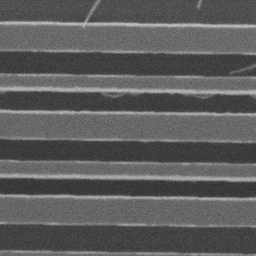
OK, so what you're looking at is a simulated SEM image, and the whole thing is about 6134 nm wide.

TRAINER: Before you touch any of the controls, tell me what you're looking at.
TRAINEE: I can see lines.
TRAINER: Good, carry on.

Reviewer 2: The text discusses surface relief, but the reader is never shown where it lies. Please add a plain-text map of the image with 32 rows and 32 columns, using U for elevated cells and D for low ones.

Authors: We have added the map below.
DDDDDDDDDDDDDDDDDDDDDDDDDDDDDDDD
DDDDDDDDDDDDDDDDDDDDDDDDDDDDDDDD
DDDDDDDDDDDDDDDDDDDDDDDDDDDDDDDD
UUUUUUUUUUUUUUUUUUUUUUUUUUUUUUUU
UUUUUUUUUUUUUUUUUUUUUUUUUUUUUUUU
UUUUUUUUUUUUUUUUUUUUUUUUUUUUUUUU
DDDDDDDDDDDDDDUUUUUUUUUUUUUUUUUU
DDDDDDDDDDDDDDDDDDDDDDDDDDDDDDDD
DDDDDDDDDDDDDDDDDDDDDDDDDDDDDDDD
UUUUUUUUUUUUUUUUDDDDDDDDDDDDDDDD
UUUUUUUUUUUUUUUUUUUUUUUUUUUUUUUU
DDDDDDDDDDDDDDDDDUUUUUUUUUUUUUUU
DDDDDDDDDDDDDDDDDDDDDDDDDDDDDDDD
DDDDDDDDDDDDDDDDDDDDDDDDDDDDDDDD
UUUUUUUUUUUUUUUUUUUUUUUUUUUUUUUU
UUUUUUUUUUUUUUUUUUUUUUUUUUUUUUUU
UUUUUUUUUUUUUUUUUUUUUUUUUUUUUUUU
DDDDDDDDDDUUUUUUUUUUUUUUUUUUUUUU
DDDDDDDDDDDDDDDDDDDDDDDDDDDDDDDD
DDDDDDDDDDDDDDDDDDDDDDDDDDDDDDDD
UUUUUUUUUUUUUUUUUUUUUUUUUUDDDDDD
UUUUUUUUUUUUUUUUUUUUUUUUUUUUUUUU
DDDDDDDDDDDDDDDDDDDDDUUUUUUUUUUU
DDDDDDDDDDDDDDDDDDDDDDDDDDDDDDDD
UUUUDUUUUDDDDDDDDDDDDDDDDDDDDDDD
UUUUUUUUUUUUUUUUUUUUUUUUUUUUUUUU
UUUUUUUUUUUUUUUUUUUUUUUUUUUUUUUU
UUUUUUUUUUUUUUUUUUUUUUUUUUUUUUUU
DDDDDDDDDDDDDDDDDDDDDDDDDDDDDDDD
DDDDDDDDDDDDDDDDDDDDDDDDDDDDDDDD
DDDDDDDDDDDDDDDDDDDDDDDDDDDDDDDD
UUUUDDDDDDDDDDDDDDDDDDDDDDDDDDDD